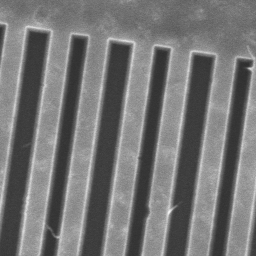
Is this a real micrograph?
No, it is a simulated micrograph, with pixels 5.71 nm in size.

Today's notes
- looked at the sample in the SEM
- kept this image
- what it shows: parallel lines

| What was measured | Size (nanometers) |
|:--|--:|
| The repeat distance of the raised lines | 238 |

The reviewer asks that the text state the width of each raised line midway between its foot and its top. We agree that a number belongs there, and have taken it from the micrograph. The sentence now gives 132 nanometers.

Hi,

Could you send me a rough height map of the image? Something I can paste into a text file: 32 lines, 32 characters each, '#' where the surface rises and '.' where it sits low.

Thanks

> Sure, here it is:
################################
################################
################################
################################
###...###.######################
###...###..###..################
###...###..###..###..###########
###...###..##...###..###...###.#
###...##..###...###..###...##..#
###...##..###...###..###...##..#
##...###..###...###..###..###..#
##...###..###...###.###...###..#
##...###..###...###.###...###..#
##...###..###..###..###...###..#
##...###..##...###..###...###..#
##...##..###...###..###...##..##
##...##..###...###..###...##..##
#...###..###...###..###..###..##
#...###..###...###.###...###..##
#...###..###...##..###...###..##
#...###..###..###..###...###..##
#...###..##...###..###...###..##
#...##..###...###..###...##..###
#...##..###...###..###...##..###
...###..###...###..###..###..###
...###..###...###.###...###..###
...###..###...###..##...###..###
...###..###..###..###...###..###
...###..##...###..###...###..##.
...##..###...###..###...###.###.
...##..###...###..###...##..###.
..###..###...###..###..###..###.